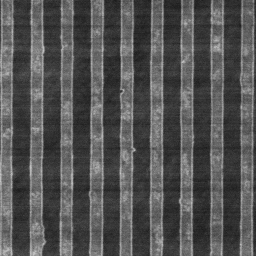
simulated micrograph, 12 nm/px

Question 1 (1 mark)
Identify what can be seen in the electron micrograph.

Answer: parallel lines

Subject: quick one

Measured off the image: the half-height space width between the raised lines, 18.8 px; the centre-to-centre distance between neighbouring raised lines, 0.36 microns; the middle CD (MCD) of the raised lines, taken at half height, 0.136 micrometres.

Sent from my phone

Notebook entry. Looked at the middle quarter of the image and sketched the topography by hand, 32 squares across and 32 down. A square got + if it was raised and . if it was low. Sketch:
++.....+++.....++.....++.....+++
++.....+++.....++.....++.....+++
++.....+++....+++.....++.....+++
++.....+++.....++.....++.....+++
++.....+++....+++.....++.....+++
++.....+++....+++.....++.....+++
++.....+++....+++.....++.....+++
++.....+++....+++.....++.....+.+
++.....+++....+++.....++.....+++
++.....+++....+++.....++.....+++
++.....+++....+++.....+++....+++
++.....+++....+++.....+++....+++
++.....++.....+++.....++.....+++
++.....++.....+++.....++.....+++
++.....+++....+++.....++.....+++
++.....+++....+++.....++.....+++
++.....+++....+++.....++......++
++.....+++....+++.....++......++
++.....+++....+++.....++......++
++.....+++....+++.....++......++
++.....+++....+++.....++.....+++
++.....+++....++++....+++....+++
++.....++.....+++.....+++.....++
++.....++.....+++.....+++.....++
++.....+++....+++.....+++.....++
++.....+++....+++.....+++....+++
++.....+++....+++.....+++....+++
++.....+++....+++.....+++....+++
++.....+++....+++.....++.....+++
++.....+++....+++.....+++....+++
++.....+++....+++.....+++....+++
++.....++.....+++.....+++....+++